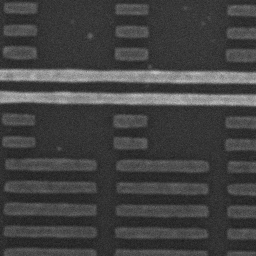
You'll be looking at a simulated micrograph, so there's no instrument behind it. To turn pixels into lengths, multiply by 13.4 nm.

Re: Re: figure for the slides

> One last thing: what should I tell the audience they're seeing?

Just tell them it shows wiring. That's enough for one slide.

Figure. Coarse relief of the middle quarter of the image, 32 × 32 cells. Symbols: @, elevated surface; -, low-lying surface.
--------------------------------
--------------------------------
@@@@@@@@@@@@@@@@@@@@@@@@@@@@@@@@
@@@@@@@@@@@@@@@@@@@@@@@@@@@@@@@@
--------------------------@@@@@@
--------------------------------
--------------------------------
@@@@@@@@@@----------------------
@@@@@@@@@@@@@@@@@@@@@@@@@@@@@@@@
@@@@@@@@@@@@@@@@@@@@@@@@@@@@@@@@
--------------------------------
--------------------------------
--------------------------------
-------------@@@@@@@@-----------
-------------@@@@@@@------------
-------------@@@@---------------
--------------------------------
--------------------------------
--------------------------------
-------------@@@@@@@------------
-------------@@@@@@@------------
--------------------------------
--------------------------------
--------------------------------
@@@@@@@@------@@@@@@@@@@@@@@@@@@
@@@@@@@@-----@@@@@@@@@@@@@@@@@@@
--------------@@@@@@@@@@@@@@@@@@
--------------------------------
--------------------------------
--------------------------------
@@@@@@@@-----@@@@@@@@@@@@@@@@@@@
@@@@@@@@-----@@@@@@@@@@@@@@@@@@@